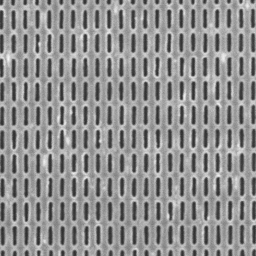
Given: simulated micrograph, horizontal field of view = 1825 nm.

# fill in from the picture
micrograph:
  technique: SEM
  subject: a regular array of holes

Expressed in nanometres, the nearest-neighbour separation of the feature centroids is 84.7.